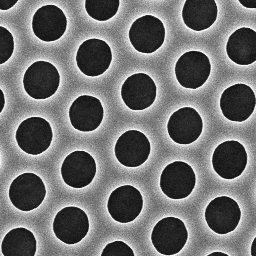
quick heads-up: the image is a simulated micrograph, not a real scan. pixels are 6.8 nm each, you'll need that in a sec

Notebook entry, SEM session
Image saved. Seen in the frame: a regular array of holes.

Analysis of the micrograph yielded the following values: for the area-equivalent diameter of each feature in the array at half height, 37 pixels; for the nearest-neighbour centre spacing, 55.8 pixels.